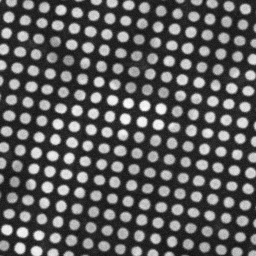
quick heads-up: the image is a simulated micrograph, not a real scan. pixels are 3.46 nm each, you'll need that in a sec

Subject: a regular array of raised bodies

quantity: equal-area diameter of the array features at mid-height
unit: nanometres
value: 35.4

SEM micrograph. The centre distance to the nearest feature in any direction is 55.2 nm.